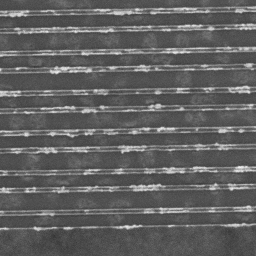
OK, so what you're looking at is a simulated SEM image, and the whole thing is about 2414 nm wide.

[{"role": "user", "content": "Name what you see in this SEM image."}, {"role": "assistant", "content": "parallel lines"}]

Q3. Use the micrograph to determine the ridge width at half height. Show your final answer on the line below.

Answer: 0.0412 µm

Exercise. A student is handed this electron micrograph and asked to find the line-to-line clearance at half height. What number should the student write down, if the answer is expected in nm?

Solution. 122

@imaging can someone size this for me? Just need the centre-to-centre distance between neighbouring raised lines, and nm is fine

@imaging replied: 188